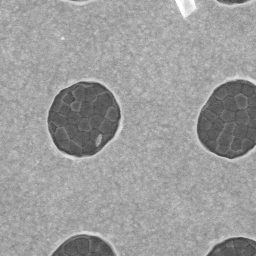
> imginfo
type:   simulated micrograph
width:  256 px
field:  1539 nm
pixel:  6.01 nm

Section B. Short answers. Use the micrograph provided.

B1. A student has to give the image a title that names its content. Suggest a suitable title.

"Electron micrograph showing holes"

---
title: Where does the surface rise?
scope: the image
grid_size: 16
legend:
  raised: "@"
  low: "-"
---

@@@@@@@@@@@@@@@@
@@@@@@@@@@@@@@@@
@@@@@@@@@@@@@@@@
@@@@@@@@@@@@@@@@
@@@@@@@@@@@@@@@@
@@@@---@@@@@@@--
@@@----@@@@@@---
@@@----@@@@@----
@@@----@@@@@----
@@@@--@@@@@@@--@
@@@@@@@@@@@@@@@@
@@@@@@@@@@@@@@@@
@@@@@@@@@@@@@@@@
@@@@@@@@@@@@@@@@
@@@@@@@@@@@@@@@@
@@@@---@@@@@@---